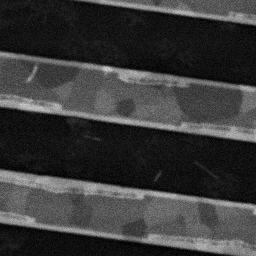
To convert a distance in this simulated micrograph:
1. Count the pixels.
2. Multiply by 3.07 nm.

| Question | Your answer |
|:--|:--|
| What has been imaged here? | one or a few lines or trenches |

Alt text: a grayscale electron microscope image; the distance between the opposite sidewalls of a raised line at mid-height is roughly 150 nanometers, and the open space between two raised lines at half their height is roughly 205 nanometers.